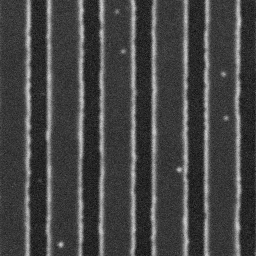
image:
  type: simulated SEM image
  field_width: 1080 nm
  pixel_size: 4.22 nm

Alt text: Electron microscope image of lines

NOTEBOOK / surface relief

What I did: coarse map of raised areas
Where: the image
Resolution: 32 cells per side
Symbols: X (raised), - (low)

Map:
XXXX--XXXX---XXXX--XXXX---XXXX--
XXXX--XXXX---XXXX--XXXX---XXXX--
XXXX--XXXX---XXXX--XXXX---XXXX--
XXXX--XXXX---XXXX--XXXX---XXXX--
XXXX--XXXX---XXXX--XXXX---XXXX--
XXXX--XXXX---XXXX--XXXX---XXXX--
XXXX--XXXX---XXXX--XXXX---XXXX--
XXXX--XXXX---XXXX--XXXX---XXXX--
XXXX--XXXX---XXXX--XXXX---XXXX--
XXXX--XXXX---XXXX--XXXX---XXXX--
XXXX--XXXX---XXXX--XXXX---XXXX--
XXXX--XXXX---XXXX--XXXX---XXXX--
XXXX--XXXX---XXXX--XXXX---XXXX--
XXXX--XXXX---XXXX--XXXX---XXXX--
XXXX--XXXX---XXXX--XXXX---XXXX--
XXXX--XXXX---XXXX--XXXX---XXXX--
XXXX--XXXX---XXXX--XXXX---XXXX--
XXXX--XXXX---XXXX--XXXX---XXXX--
XXXX--XXXX---XXXX--XXXX---XXXX--
XXXX--XXXX---XXXX--XXXX---XXXX--
XXXX--XXXX---XXXX--XXXX---XXXX--
XXXX--XXXX---XXXX--XXXX---XXXX--
XXXX--XXXX---XXXX--XXXX---XXXX--
XXXX--XXXX---XXXX--XXXX---XXXX--
XXXX--XXXX---XXXX--XXXX---XXXX--
XXX---XXXX---XXXX--XXXX---XXXX--
XXXX--XXXX---XXXX--XXXX---XXXX--
XXXX--XXXX---XXXX--XXXX---XXXX--
XXXX--XXXX--XXXXX--XXXX---XXXX--
XXXX--XXXX---XXXX--XXXX---XXXX--
XXXX--XXXX---XXXX--XXXX---XXXX--
XXXX--XXXX---XXXX--XXXX---XXXX--